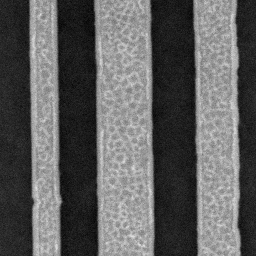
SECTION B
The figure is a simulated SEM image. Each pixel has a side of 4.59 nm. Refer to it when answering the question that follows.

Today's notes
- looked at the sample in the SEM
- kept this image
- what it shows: one or a few lines or trenches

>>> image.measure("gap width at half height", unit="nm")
208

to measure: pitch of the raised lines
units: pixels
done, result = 85.9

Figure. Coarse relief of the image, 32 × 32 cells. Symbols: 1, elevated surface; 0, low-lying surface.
00001110000011111110000011111000
00001110000011111110000011111000
00001110000011111110000011111000
00001110000011111110000001111000
00001110000011111110000001111000
00001110000011111110000001111000
00001110000011111110000001111000
00001110000011111110000001111000
00001110000011111110000001111000
00001110000011111110000001111000
00001110000011111110000001111000
00001110000011111110000001111000
00001110000011111110000001111000
00001110000011111110000001111000
00001110000011111110000001111000
00001110000011111110000001111000
00001110000001111110000001111100
00001110000011111110000001111100
00001110000011111110000001111000
00001110000001111110000001111000
00001110000001111110000001111100
00001110000001111110000001111100
00001110000001111110000001111100
00001110000001111110000001111100
00001110000001111110000001111100
00000110000001111110000001111100
00001110000011111110000001111100
00001110000001111110000001111000
00001110000001111110000001111000
00001110000001111110000001111100
00001110000001111110000001111100
00001110000001111110000001111100